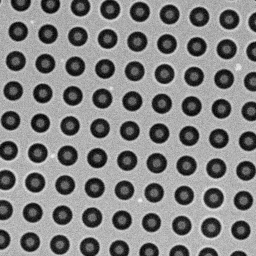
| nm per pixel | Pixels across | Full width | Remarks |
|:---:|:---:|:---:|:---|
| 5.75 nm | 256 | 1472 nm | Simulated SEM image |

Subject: an array of small figures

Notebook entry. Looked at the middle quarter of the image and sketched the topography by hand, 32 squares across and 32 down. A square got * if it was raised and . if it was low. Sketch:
.....***.....**.....***....*****
.....***.....**.....***.....**..
*...****....***.....**......**..
*********..*****....***.....**..
***********************....***..
**.****************************.
....****...*********************
.....**.....***....*****.*******
.....**.....***.....**.....***..
....***.....**......**.....***..
**.*****...****....***.....**...
****************...***....****..
************************.*****..
...*****************************
....***....****...**************
....**......**.....***....****..
....**......**.....**.....***...
...****....***.....**.....***...
********..*****...***.....***...
**********************...****...
..*****************************.
...****...**********************
....**.....***....****..********
....**.....**.....***.....***...
...***.....**.....***.....**....
*.*****...****....***.....**....
***************..****....***....
***********************.*****...
..*****.************************
...***....****...***************
...**.....***....****...*****..*
...**.....***.....**.....***....